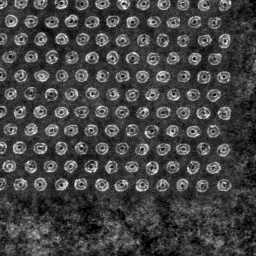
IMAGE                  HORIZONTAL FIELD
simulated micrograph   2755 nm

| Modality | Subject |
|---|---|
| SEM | a regular array of ring-shaped raised bodies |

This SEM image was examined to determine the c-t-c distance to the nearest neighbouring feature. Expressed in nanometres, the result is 213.